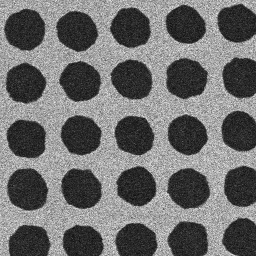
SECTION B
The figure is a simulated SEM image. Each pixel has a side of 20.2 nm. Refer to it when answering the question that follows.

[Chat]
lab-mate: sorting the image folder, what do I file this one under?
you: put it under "a regular array of holes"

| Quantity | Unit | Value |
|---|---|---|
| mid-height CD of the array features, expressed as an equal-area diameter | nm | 807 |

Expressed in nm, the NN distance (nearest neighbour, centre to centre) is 1040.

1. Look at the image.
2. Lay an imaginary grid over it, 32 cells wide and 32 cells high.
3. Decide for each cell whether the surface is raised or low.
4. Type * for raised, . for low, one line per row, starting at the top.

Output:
********************************
**...****.*****...***....**.....
*....**.....**.....**....**.....
*.....*.....**.....**.....*.....
*.....*.....**.....**....***....
*....***....***...**************
********************************
****************.*****..*****..*
**..****....**....***....***....
*....***.....*.....**.....**....
*.....**.....*.....**.....**....
*....***....***....**....****...
**...****..*********************
********************************
*********.******.******.****...*
**...***....***....**....***....
*.....**.....*.....**.....**....
*.....**.....*.....**.....**....
*.....**....***....***...****...
**...***************************
********************************
**...****..****....***...****...
*....***....***....**.....**....
*.....**.....**.....*.....**....
*.....**.....**....**.....**....
**....***...****..****...****...
********************************
*****************************..*
**...****...***....***....**....
*.....**.....**....**.....**....
*.....**.....*......*.....**....
*.....**.....**....**.....***...